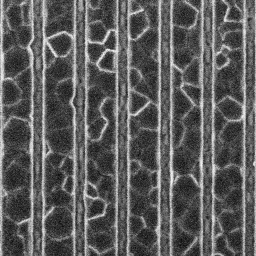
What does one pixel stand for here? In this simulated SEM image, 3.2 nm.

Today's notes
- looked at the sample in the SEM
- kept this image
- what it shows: parallel lines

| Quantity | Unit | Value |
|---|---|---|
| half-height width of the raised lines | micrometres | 0.104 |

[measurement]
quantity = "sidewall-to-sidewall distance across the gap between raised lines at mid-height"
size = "9.62 px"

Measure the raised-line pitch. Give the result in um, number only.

0.135